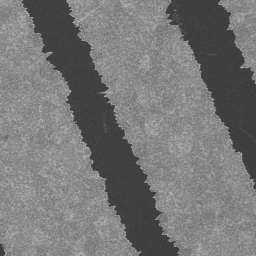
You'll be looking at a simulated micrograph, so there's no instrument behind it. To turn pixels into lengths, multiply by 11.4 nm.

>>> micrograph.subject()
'one or a few lines or trenches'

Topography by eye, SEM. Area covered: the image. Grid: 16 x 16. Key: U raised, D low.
UUDDUUUUUUDDDDUU
UUDDDUUUUUUDDDUU
UUUDDUUUUUUUDDDU
UUUDDDUUUUUUDDDU
UUUUDDUUUUUUDDDD
UUUUDDDUUUUUUDDD
UUUUDDDUUUUUUDDD
UUUUUDDUUUUUUUDD
UUUUUDDDUUUUUUDD
UUUUUUDDUUUUUUUD
UUUUUUDDDUUUUUUD
UUUUUUDDDUUUUUUU
UUUUUUUDDDUUUUUU
UUUUUUUDDDUUUUUU
UUUUUUUUDDUUUUUU
UUUUUUUUDDDUUUUU